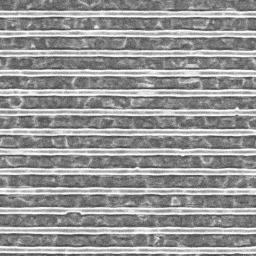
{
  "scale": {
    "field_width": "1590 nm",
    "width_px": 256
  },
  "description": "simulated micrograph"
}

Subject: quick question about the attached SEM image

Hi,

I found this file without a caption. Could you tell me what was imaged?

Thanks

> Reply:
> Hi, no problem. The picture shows parallel lines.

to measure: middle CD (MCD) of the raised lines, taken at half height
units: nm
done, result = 33.4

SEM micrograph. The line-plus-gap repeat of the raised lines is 122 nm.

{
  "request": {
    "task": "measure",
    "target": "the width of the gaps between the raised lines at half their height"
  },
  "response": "89.3 nanometers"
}